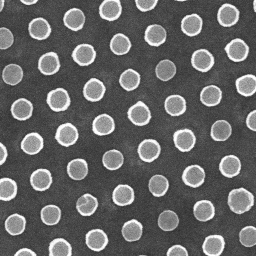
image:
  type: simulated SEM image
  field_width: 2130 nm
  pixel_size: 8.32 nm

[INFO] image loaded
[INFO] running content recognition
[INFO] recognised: a regular array of raised bodies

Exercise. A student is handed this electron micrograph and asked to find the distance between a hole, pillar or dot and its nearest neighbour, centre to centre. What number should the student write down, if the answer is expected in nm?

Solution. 301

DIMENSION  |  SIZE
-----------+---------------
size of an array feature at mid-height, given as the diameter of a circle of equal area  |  182 nm